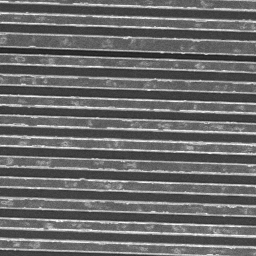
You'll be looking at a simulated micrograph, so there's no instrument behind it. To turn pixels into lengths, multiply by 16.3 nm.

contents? parallel lines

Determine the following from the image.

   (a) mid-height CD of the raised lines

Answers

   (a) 179 nm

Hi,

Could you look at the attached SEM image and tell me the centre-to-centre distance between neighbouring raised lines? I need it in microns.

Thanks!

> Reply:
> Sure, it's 0.335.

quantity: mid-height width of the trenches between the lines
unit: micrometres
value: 0.147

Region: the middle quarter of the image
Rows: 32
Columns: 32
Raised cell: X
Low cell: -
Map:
XXXXXXXXXXXXXXXXXXXXXXXXXXXXXXXX
-------------------------------X
--------------------------------
XXXXXXXXXXX---------------------
XXXXXXXXXXXXXXXXXXXXXXXXXXXXXXXX
XXXXXXXXXXXXXXXXXXXXXXXXXXXXXXXX
--------------------XX---XXXXXXX
--------------------------------
XXXX----------------------------
XXXXXXXXXXXXXXXXXXXXXXXXXXXXXXXX
XXXXXXXXXXXXXXXXXXXXXXXXXXXXXXXX
------------------XXX-XXXXXXXXXX
--------------------------------
XXXX----X-----------------------
XXXXXXXXXXXXXXXXXXXXXXXXXXXXXXXX
XXXXXXXXXXXXXXXXXXXXXXXXXXXXXXXX
-----------------XXXXXXXXXXXXXXX
--------------------------------
XXX-----------------------------
XXXXXXXXXXXXXXXXXXXXXXXXXXXXXXXX
XXXXXXXXXXXXXXXXXXXXXXXXXXXXXXXX
-----------------XXXXXXXXXXXXXXX
--------------------------------
--------------------------------
XXXXXXXXXXXXXXXXXXXXXXXXX-------
XXXXXXXXXXXXXXXXXXXXXXXXXXXXXXXX
----------XXXXXXXXXXXXXXXXXXXXXX
--------------------------------
--------------------------------
XXXXXXXXXXXXXXXXXXXXX-XX--------
XXXXXXXXXXXXXXXXXXXXXXXXXXXXXXXX
-----XXX-XXXXXXXXXXXXXXXXXXXXXXX